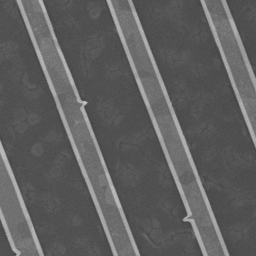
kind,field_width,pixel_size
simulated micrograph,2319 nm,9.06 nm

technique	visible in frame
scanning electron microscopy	one or a few lines or trenches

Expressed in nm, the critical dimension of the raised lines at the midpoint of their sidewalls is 185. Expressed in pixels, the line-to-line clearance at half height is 64.9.